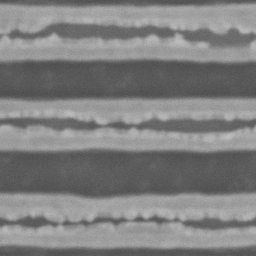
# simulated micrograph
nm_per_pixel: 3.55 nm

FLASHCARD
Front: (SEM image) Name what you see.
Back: one or a few lines or trenches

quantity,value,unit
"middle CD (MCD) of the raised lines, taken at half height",138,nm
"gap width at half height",197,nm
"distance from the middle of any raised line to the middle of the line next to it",335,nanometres